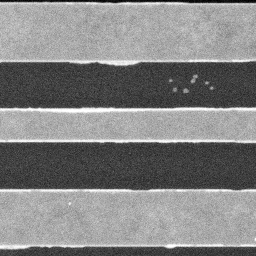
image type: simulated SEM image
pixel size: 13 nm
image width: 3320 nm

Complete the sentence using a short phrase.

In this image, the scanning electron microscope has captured lines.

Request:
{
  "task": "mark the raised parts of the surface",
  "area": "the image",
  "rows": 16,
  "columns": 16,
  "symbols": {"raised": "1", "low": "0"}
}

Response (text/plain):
1111111111111111
1111111111111111
1111111111111111
1111111111111111
0000000000000000
0000000000000000
0000000000000000
1111111111111111
1111111111111111
0000000000000000
0000000000000000
0000000000000000
1111111111111111
1111111111111111
1111111111111111
0000000000000000